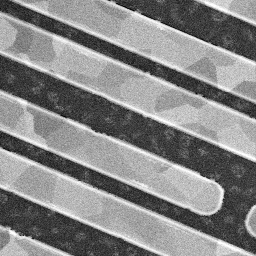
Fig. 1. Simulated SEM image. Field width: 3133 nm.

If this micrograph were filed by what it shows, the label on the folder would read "one or a few lines or trenches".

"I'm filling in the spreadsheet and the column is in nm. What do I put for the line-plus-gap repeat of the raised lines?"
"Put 741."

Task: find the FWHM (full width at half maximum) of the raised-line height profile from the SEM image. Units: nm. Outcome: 417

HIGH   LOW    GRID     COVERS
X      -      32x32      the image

---XXXXXXXXXXX------------XXXXXX
-----XXXXXXXXXXX------------XXXX
XX------XXXXXXXXXXX------------X
XXXX------XXXXXXXXXXX-----------
XXXXXX-------XXXXXXXXXX---------
XXXXXXXXX------XXXXXXXXXXX------
XXXXXXXXXXX------XXXXXXXXXXX----
---XXXXXXXXXXX------XXXXXXXXXXX-
-----XXXXXXXXXXX------XXXXXXXXXX
-------XXXXXXXXXXXX-----XXXXXXXX
----------XXXXXXXXXXX------XXXXX
------------XXXXXXXXXXX------XXX
XX------------XXXXXXXXXXXX-----X
XXXX-------------XXXXXXXXXXX----
XXXXXXX------------XXXXXXXXXXX--
XXXXXXXXX------------XXXXXXXXXXX
-XXXXXXXXXXX------------XXXXXXXX
----XXXXXXXXXX------------XXXXXX
------XXXXXXXXXXX------------XXX
XX------XXXXXXXXXXX------------X
XXXX-------XXXXXXXXXX-----------
XXXXXXX------XXXXXXXXXXX--------
XXXXXXXXX------XXXXXXXXXXX------
-XXXXXXXXXX-------XXXXXXXXX-----
---XXXXXXXXXXX------XXXXXXXX----
-----XXXXXXXXXXX-------XXXX-----
--------XXXXXXXXXX-------XX----X
----------XXXXXXXXXXX----------X
-------------XXXXXXXXXX--------X
XX-------------XXXXXXXXXX-------
XXXXX------------XXXXXXXXXXX----
XXXXXXX-------------XXXXXXXXXX--